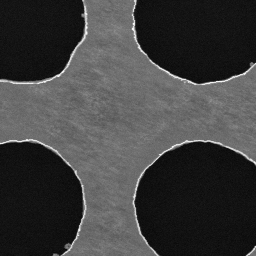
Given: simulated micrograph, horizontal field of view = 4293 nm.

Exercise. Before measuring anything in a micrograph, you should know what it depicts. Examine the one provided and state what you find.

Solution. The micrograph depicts holes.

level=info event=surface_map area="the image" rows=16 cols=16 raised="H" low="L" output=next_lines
LLLLLHHHLLLLLLLL
LLLLLHHHLLLLLLLL
LLLLLHHHHLLLLLLL
LLLLHHHHHLLLLLLL
LLLLHHHHHHLLLLLH
HHHHHHHHHHHHHHHH
HHHHHHHHHHHHHHHH
HHHHHHHHHHHHHHHH
HHHHHHHHHHHHHHHH
LLLHHHHHHHLLLLLH
LLLLHHHHHLLLLLLL
LLLLLHHHHLLLLLLL
LLLLLHHHLLLLLLLL
LLLLLHHHHLLLLLLL
LLLLLHHHHLLLLLLL
LLLLHHHHHLLLLLLL